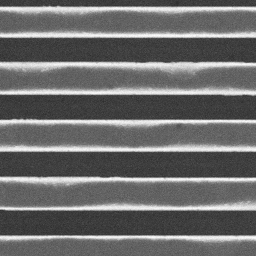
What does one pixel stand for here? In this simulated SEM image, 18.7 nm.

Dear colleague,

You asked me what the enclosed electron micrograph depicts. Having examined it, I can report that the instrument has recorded lines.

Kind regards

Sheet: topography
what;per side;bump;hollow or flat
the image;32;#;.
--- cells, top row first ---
................................
################################
################################
################################
################################
................................
................................
................................
################################
################################
################################
################################
................................
................................
................................
################################
################################
################################
################################
................................
................................
................................
################################
################################
################################
################################
................................
................................
................................
................................
################################
################################